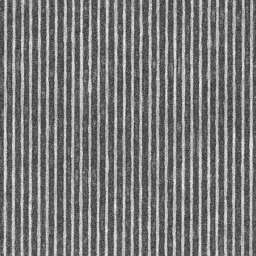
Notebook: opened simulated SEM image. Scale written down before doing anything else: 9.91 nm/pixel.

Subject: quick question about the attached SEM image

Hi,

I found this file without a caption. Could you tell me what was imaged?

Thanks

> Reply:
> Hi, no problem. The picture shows parallel lines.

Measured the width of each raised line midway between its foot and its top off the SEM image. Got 0.0198 microns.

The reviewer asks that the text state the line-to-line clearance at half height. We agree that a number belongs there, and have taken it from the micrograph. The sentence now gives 0.0632 µm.